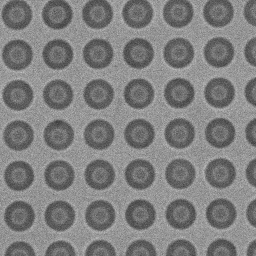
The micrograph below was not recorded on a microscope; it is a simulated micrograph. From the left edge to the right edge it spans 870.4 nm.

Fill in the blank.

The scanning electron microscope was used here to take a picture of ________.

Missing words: an array of small figures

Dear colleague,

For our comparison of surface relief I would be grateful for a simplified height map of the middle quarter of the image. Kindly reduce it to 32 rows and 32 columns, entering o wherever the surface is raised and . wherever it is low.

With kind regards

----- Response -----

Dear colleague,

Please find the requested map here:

.ooooo.....ooooo.....ooooo.....o
oooooooooooooooooooooooooooooooo
oooooooooooooooooooooooooooooooo
oooooooooooooooooooooooooooo..oo
.ooooo.....ooooo.....ooooo......
..ooo.......ooo.......ooo.......
..ooo.......ooo........oo.......
...oo........oo........oo.......
..ooo.......ooo.......ooo.......
..ooo.......ooo.......oooo......
.ooooo.....ooooo.....ooooo.....o
oooooooo.ooooooooooooooooooooooo
oooooooooooooooooooooooooooooooo
oooooooooooooooooooooooooooo.ooo
.ooooo.....ooooo.....ooooo......
..ooo.......ooo.......ooo.......
..ooo........oo........oo.......
...oo........oo........oo.......
...oo........oo........oo.......
..ooo.......oooo......ooo.......
.ooooo.....ooooo.....ooooo.....o
oooooooo.ooooooooooooooooooooooo
oooooooooooooooooooooooooooooooo
oooooooooooooooooooooooooooooooo
.oooooo....oooooo....oooooo.....
..oooo......oooo......oooo......
...oo........oo........oo.......
...oo........oo........oo.......
...oo........oo........oo.......
..ooo.......oooo......oooo......
..oooo......oooo......ooooo.....
oooooooo..oooooooo.ooooooooooooo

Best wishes